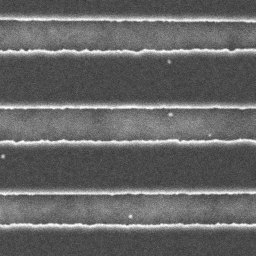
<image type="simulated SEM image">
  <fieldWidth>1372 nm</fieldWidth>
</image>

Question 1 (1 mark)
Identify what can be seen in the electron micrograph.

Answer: lines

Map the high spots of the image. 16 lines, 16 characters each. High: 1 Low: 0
1111111111111111
0000000000000000
0000000000000000
1111111111111111
1111111111111111
1111111111111111
1111111111111111
0000000000000000
0000000000000000
1111111111111111
1111111111111111
1111111111111111
0000000000000000
0000000000000000
1111111111111111
1111111111111111